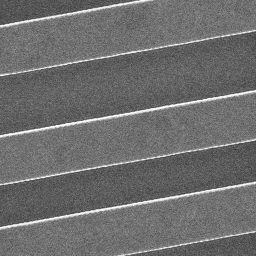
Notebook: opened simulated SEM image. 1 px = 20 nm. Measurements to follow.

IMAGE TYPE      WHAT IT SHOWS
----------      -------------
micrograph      lines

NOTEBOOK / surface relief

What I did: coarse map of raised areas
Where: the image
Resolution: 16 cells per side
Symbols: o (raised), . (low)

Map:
......oooooooooo
.ooooooooooooooo
ooooooooooooo...
ooooooo.........
o...............
................
...........ooooo
......oooooooooo
oooooooooooooooo
oooooooooooo....
oooooo..........
...............o
..........oooooo
....oooooooooooo
oooooooooooooooo
oooooooooo......